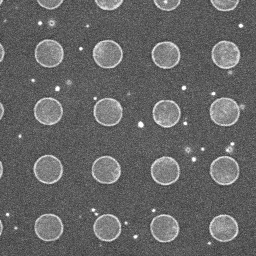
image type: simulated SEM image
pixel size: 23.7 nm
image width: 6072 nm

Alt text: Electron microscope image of a regular array of raised bodies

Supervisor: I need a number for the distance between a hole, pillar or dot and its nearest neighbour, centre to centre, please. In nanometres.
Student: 1370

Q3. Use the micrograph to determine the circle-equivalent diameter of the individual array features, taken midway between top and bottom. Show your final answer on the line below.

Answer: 27.3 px